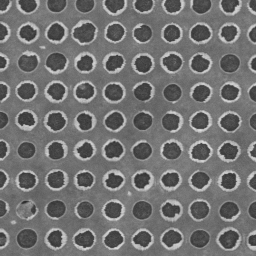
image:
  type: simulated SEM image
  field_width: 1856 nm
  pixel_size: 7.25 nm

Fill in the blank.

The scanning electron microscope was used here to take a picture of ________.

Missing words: a regular array of holes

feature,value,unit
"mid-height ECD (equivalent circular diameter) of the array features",125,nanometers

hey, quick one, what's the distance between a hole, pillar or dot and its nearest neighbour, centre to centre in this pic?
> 0.205 micrometres